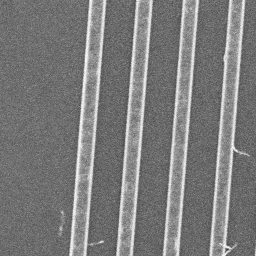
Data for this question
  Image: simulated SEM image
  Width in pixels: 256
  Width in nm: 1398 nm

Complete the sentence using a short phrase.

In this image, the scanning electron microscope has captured parallel lines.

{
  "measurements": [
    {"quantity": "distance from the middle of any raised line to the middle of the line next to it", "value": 253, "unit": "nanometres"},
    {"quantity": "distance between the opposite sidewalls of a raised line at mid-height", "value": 80.9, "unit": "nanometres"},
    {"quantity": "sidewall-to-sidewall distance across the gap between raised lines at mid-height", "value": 172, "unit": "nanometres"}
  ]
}